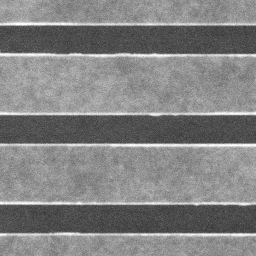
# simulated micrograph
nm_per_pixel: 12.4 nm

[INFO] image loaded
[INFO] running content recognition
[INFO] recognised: lines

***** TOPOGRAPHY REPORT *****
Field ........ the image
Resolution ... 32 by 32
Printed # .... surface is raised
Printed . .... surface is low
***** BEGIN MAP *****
################################
################################
################################
................................
................................
................................
................................
################################
################################
################################
################################
################################
################################
################################
................................
................................
................................
................................
################################
################################
################################
################################
################################
################################
################################
................................
................................
................................
................................
################################
################################
################################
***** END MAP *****